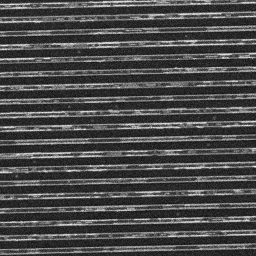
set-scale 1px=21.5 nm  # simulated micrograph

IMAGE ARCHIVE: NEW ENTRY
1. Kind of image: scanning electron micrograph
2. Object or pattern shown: parallel lines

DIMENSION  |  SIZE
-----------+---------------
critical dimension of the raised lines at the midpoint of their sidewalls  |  99.5 nanometres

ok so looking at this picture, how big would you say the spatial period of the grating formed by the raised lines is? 293 nanometers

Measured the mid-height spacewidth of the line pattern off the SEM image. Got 199 nm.